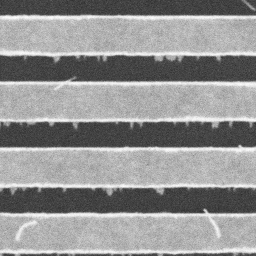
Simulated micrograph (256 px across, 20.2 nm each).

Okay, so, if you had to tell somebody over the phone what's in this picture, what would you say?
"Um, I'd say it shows lines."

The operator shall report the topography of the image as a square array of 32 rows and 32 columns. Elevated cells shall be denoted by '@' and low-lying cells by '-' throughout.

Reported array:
--------------------------------
--------------------------------
@@@@@@@@@@@@@@@@@@@@@@@@@@@@@@@@
@@@@@@@@@@@@@@@@@@@@@@@@@@@@@@@@
@@@@@@@@@@@@@@@@@@@@@@@@@@@@@@@@
@@@@@@@@@@@@@@@@@@@@@@@@@@@@@@@@
@@@@@@@@@@@@@@@@@@@@@@@@@@@@@@@@
--------------------------------
--------------------------------
--------------------------------
@@@@@@@@@@@@@@@@@@@@@@@@@@@@@@@@
@@@@@@@@@@@@@@@@@@@@@@@@@@@@@@@@
@@@@@@@@@@@@@@@@@@@@@@@@@@@@@@@@
@@@@@@@@@@@@@@@@@@@@@@@@@@@@@@@@
@@@@@@@@@@@@@@@@@@@@@@@@@@@@@@@@
--------------------------------
--------------------------------
--------------------------------
---------------@--@@---------@@-
@@@@@@@@@@@@@@@@@@@@@@@@@@@@@@@@
@@@@@@@@@@@@@@@@@@@@@@@@@@@@@@@@
@@@@@@@@@@@@@@@@@@@@@@@@@@@@@@@@
@@@@@@@@@@@@@@@@@@@@@@@@@@@@@@@@
--------------------------------
--------------------------------
--------------------------------
--------------------------------
@@@@@@@@@@@@@@@@@@@@@@@@@@@@@@@@
@@@@@@@@@@@@@@@@@@@@@@@@@@@@@@@@
@@@@@@@@@@@@@@@@@@@@@@@@@@@@@@@@
@@@@@@@@@@@@@@@@@@@@@@@@@@@@@@@@
@@@@@@@@@@@@@@@@@@@@@@@@@@@@@@@@